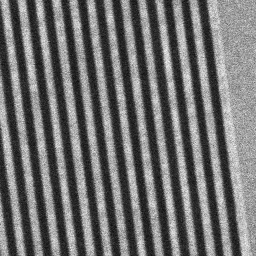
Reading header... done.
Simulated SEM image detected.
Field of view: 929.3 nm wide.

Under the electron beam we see parallel lines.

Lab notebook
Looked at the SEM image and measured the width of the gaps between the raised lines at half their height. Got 0.0283 micrometres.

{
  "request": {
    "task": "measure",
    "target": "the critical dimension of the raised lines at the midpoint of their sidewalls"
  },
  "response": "8.79 pixels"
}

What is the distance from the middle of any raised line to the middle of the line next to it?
0.062 micrometres